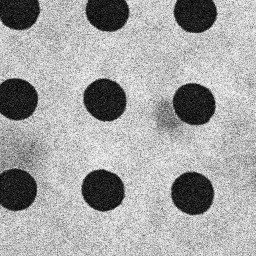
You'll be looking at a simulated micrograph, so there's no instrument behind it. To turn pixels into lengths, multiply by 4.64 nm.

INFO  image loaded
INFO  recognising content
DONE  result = holes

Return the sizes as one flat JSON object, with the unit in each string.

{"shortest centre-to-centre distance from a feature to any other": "414 nm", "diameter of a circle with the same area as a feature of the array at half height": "198 nm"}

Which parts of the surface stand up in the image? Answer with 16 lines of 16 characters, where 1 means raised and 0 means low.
0011100011100111
0011110011100111
1111111111111111
1111111111111111
1111111111111111
0011100011100111
0011100011100111
1111110111100111
1111111111111111
1111111111111111
1111111111111111
0011100011100111
0011100011100111
1111111111111111
1111111111111111
1111111111111111